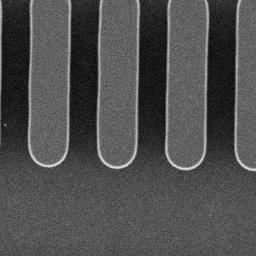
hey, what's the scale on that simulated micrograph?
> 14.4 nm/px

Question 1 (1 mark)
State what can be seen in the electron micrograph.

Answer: groups of lines, slits or small figures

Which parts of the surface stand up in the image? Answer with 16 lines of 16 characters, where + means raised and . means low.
..++..+++..++..+
..++..+++..++..+
..++..+++..++..+
..++..+++.+++..+
..++..+++.+++..+
..++..+++.+++..+
..++..+++.+++..+
..++..+++.+++..+
..++..+++.+++..+
..++..++..+++..+
...........+...+
................
................
................
................
................